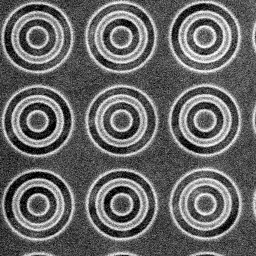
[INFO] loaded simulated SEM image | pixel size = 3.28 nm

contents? an array of small figures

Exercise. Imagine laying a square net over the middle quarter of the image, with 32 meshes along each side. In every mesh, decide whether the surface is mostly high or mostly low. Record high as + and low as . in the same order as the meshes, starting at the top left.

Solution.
++++++++++.........++++++++++++.
++++++++++++....++++++++++++++++
++++++++++++++++++++++++++++++++
++++++++++++++++++++++++++++++++
++++++++++++++++++++++++++++++++
++++++++++++++++++++++++++++++++
+++++++++++.......++++++++++++++
+++++++++...........++++++++++..
++++++++...++++++....++++++++...
+++++++...++++.++++...++++++...+
.++++++..++......+++..++++++..++
.+++++..++........++...++++..++.
..++++..++..++++...+...++++..++.
..++++..++..+++++..++..++++..++.
..++++..++..+++++..++..++++..+..
..++++..++..+++++..++..++++..++.
..++++..++...+++...+...++++..++.
.++++++..++.......++..+++++...++
.++++++..+++....+++...++++++...+
++++++++...+++++++...++++++++...
+++++++++....+++....++++++++++..
++++++++++.........++++++++++++.
+++++++++++++...++++++++++++++++
++++++++++++++++++++++++++++++++
++++++++++++++++++++++++++++++++
++++++++++++++++++++++++++++++++
++++++++++++++++++++++++++++++++
+++++++++++.......+++++++++++++.
+++++++++...........++++++++++..
++++++++...+++++++...++++++++...
.++++++...+++...+++...++++++...+
.++++++..++.......++..++++++..++